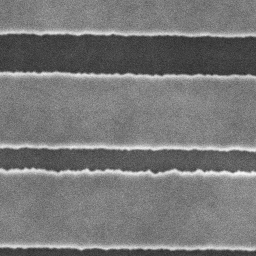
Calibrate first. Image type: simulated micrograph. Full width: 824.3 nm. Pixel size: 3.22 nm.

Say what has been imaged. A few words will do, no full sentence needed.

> lines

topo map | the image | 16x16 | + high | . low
++++++++++++++++
++++++++++++++++
................
................
................
++++++++++++++++
++++++++++++++++
++++++++++++++++
++++++++++++++++
++++++++++++++++
++++++++++++++++
++++++++++++++++
++++++++++++++++
++++++++++++++++
++++++++++++++++
.....+++++++++++